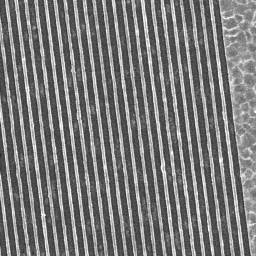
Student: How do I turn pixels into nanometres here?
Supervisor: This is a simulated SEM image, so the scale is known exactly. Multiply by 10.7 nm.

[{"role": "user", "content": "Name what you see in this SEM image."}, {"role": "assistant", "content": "parallel lines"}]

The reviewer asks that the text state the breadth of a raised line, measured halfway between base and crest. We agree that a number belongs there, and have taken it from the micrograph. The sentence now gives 27.7 nanometres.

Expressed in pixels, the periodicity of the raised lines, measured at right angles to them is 9.65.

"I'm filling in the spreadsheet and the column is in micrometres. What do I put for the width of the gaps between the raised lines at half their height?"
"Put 0.0766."